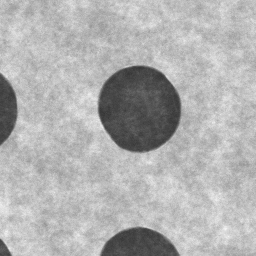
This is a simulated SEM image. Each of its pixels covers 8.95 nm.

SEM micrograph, holes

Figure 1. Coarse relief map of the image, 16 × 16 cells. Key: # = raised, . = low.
################
################
################
################
#######...######
.#####.....#####
.#####.....#####
.#####.....#####
.######....#####
################
################
################
################
################
########..######
######.....#####